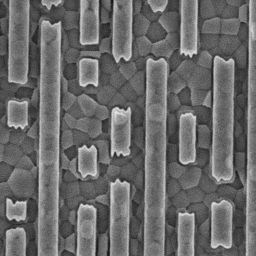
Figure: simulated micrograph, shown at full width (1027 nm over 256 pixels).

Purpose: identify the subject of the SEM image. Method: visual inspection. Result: parallel lines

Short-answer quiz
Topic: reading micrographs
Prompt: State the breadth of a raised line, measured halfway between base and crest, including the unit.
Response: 78.1 nanometers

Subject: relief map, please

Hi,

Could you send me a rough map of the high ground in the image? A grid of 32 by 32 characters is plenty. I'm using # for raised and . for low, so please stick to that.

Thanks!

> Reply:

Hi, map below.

.###.##...##..##...##..##......#
.###......##..##.......##......#
.###......##..##.......##......#
.###.###..##..##.......##......#
.##..###..##..##.......##......#
.##..##.......##.......##......#
.##..##.......##.......#.......#
.##..##...##...............#...#
.##..##...##......###......##..#
.##..##...##......###......##..#
.....##...#.......###......##..#
.....##...........###......##..#
.....##...........###......##..#
.##..##...........###......##..#
.##..##.......##..###..#...##..#
.##..##.......##..###..#...##..#
.....##.......##..###.##...##..#
.....##.......##..###.##...##..#
.....##...##..##..###.##...##..#
.....##...##......###.##...##..#
.....##...##......###......##..#
.....##...##......###......##..#
.....##...........###..........#
.....##.......##..###..........#
.....##.......##..###..........#
.##..##.......##..###......##..#
.##..##...##..##..###.....###..#
..#..##...##..##..###.##..###..#
..#..##...##..##..###.##..###..#
.##..##...##..##..##..##..###..#
.##..##...##.###..##..##...##..#
.##..##...######..##..##.......#